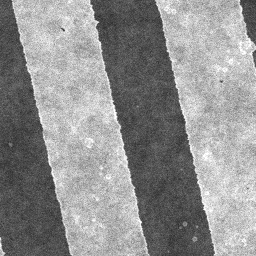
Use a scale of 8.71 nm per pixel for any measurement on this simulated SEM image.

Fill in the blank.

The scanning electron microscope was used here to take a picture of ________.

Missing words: one or a few lines or trenches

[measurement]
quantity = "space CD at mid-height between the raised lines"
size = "575 nm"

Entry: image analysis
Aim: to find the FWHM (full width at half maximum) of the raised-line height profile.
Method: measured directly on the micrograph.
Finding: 649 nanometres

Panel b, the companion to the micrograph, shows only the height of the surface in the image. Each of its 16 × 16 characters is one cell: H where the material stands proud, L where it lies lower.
LHHHHHLLLLHHHHHL
LHHHHHLLLLHHHHHL
LHHHHHLLLLHHHHHH
LLHHHHLLLLLHHHHH
LLHHHHHLLLLHHHHH
LLHHHHHLLLLHHHHH
LLHHHHHLLLLHHHHH
LLLHHHHLLLLLHHHH
LLLHHHHHLLLLHHHH
LLLHHHHHLLLLHHHH
LLLHHHHHLLLLHHHH
LLLHHHHHLLLLHHHH
LLLLHHHHLLLLLHHH
LLLLHHHHHLLLLHHH
LLLLHHHHHLLLLHHH
LLLLHHHHHLLLLHHH